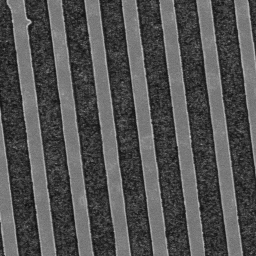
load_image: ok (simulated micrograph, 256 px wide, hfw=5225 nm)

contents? parallel lines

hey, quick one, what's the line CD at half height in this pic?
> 281 nanometres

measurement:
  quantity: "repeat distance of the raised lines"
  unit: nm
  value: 756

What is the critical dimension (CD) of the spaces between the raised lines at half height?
471 nanometres